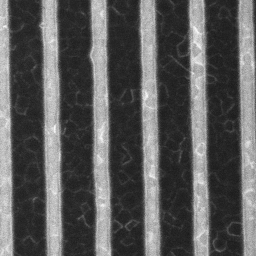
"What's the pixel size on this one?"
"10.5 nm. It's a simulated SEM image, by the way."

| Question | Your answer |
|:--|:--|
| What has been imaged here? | parallel lines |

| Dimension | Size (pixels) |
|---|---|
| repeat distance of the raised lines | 49.1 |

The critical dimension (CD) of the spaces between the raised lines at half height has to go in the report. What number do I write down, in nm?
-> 128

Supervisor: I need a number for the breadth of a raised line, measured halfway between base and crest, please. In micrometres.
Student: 0.378